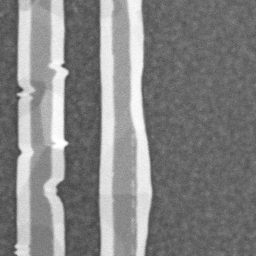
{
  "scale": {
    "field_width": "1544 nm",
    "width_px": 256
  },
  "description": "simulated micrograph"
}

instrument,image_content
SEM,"one or a few lines or trenches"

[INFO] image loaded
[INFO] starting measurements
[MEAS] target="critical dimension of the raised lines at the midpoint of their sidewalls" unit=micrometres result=0.203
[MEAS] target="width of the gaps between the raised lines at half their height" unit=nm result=292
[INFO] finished